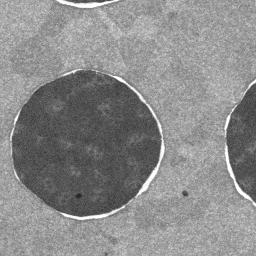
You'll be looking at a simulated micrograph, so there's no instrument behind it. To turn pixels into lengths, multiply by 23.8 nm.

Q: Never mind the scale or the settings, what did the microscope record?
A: holes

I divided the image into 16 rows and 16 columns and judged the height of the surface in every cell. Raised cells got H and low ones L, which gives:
HHHHHHHHHHHHHHHH
HHHHHHHHHHHHHHHH
HHHHHHHHHHHHHHHH
HHHHHHHHHHHHHHHH
HHHHLLHHHHHHHHHH
HHLLLLLLHHHHHHHH
HHLLLLLLLHHHHHHL
HLLLLLLLLLHHHHLL
HLLLLLLLLLHHHHLL
HLLLLLLLLLHHHHLL
HLLLLLLLLLHHHHLL
HLLLLLLLLHHHHHHL
HHHLLLLLHHHHHHHH
HHHHLLHHHHHHHHHH
HHHHHHHHHHHHHHHH
HHHHHHHHHHHHHHHH